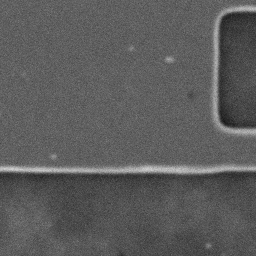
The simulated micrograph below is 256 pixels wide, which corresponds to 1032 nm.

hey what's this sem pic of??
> wiring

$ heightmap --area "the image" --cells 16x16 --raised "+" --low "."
++++++++++++++++
++++++++++++++..
++++++++++++++..
++++++++++++++..
++++++++++++++..
++++++++++++++..
++++++++++++++..
++++++++++++++..
++++++++++++++++
++++++++++++++++
++++++++++++++++
................
................
................
................
................